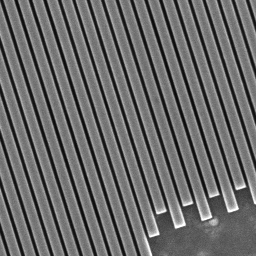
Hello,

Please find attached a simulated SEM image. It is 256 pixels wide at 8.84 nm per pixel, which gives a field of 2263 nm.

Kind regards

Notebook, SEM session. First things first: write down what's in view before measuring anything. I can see parallel lines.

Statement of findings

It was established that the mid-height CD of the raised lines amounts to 89.6 nm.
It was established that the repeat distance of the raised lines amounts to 122 nm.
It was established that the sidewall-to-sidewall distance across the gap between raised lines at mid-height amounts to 0.0327 micrometres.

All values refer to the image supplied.